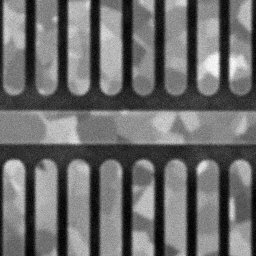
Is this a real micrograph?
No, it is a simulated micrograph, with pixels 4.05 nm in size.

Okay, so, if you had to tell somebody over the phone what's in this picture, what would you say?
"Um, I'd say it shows groups of lines, slits or small figures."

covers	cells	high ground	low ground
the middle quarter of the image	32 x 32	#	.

.#####...#####...#####...######.
.#####...#####...#####...######.
.#####...#####...#####...######.
.#####...#####...#####...######.
.#####...#####...#####...######.
.#####...#####...#####...######.
..####....####....####....####..
...##......##......##......##...
................................
................................
................................
................................
################################
################################
################################
################################
################################
################################
################################
################################
................................
................................
................................
................................
..###.....###.....###......##...
.#####...#####....####....####..
.#####...#####...#####...#####..
.#####...#####...#####...#####..
.#####...#####...#####...#####..
.#####...#####...#####...#####..
.#####...#####...#####...#####..
.#####...#####...#####...#####..